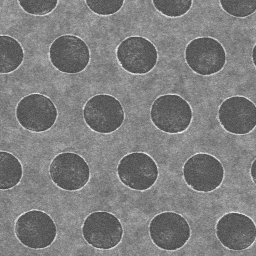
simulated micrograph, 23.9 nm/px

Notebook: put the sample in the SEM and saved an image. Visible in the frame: a regular array of holes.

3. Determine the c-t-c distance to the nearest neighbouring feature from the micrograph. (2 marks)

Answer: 1590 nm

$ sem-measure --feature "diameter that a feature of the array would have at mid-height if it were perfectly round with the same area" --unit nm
936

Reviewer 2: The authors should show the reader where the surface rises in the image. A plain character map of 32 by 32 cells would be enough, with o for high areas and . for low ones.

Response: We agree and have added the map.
ooo....oooo....oooo.....oooo....
ooo...oooooo..oooooo...ooooo....
oooooooooooooooooooooooooooooooo
oooooooooooooooooooooooooooooooo
.ooooooo.ooooooooooooooooooooooo
..ooooo....oooo....ooooo....oooo
...ooo.....oooo.....ooo.....oooo
...ooo.....oooo.....ooo.....oooo
..ooooo....ooooo...ooooo.o..oooo
oooooooooooooooooooooooooooooooo
oooooooooooooooooooooooooooooooo
oooooooooooooooooooooooooooooooo
ooo...ooooo....oooo....ooooo...o
oo.....oooo....oooo.....ooo.....
oo.....ooo......ooo.....ooo.....
ooo....oooo....oooo.....oooo....
oooooooooooo..ooooooo.ooooooo..o
oooooooooooooooooooooooooooooooo
oooooooooooooooooooooooooooooooo
..ooooo...oooooo...ooooo..oooooo
...ooo.....oooo....oooo.....oooo
...ooo.....oooo...o.ooo.....ooo.
...oooo....oooo....oooo.....oooo
.ooooooo..oooooo...ooooo...ooooo
oooooooooooooooooooooooooooooooo
oooooooooooooooooooooooooooooooo
ooo..ooooooo.ooooooooooooooooooo
oo.....oooo....oooo....oooo....o
oo.....ooo.....oooo.....ooo.....
oo.....ooo.....oooo.....ooo.....
ooo...ooooo....oooo....ooooo...o
oooooooooooooooooooooooooooooooo